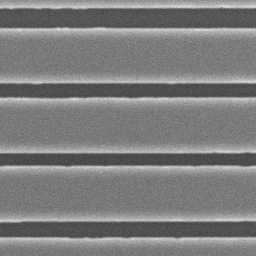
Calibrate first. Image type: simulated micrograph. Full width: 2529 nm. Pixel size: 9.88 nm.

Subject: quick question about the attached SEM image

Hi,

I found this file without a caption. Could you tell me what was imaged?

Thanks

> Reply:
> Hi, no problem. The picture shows lines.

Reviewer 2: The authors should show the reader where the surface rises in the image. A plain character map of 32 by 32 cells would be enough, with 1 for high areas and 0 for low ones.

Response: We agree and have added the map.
11111111111111111111111111111111
00000000000000000000000000000000
00000000000000000000000000000000
00000000000000000000000000000000
11111111111111111111111111111111
11111111111111111111111111111111
11111111111111111111111111111111
11111111111111111111111111111111
11111111111111111111111111111111
11111111111111111111111111111111
00000000000000000000000000000000
00000000000000000000000000000000
11111111111111111111111111111111
11111111111111111111111111111111
11111111111111111111111111111111
11111111111111111111111111111111
11111111111111111111111111111111
11111111111111111111111111111111
11111111111111111111111111111111
00000000000000000000000000000000
00000000000000000000000000000000
11111111111111111111111111111111
11111111111111111111111111111111
11111111111111111111111111111111
11111111111111111111111111111111
11111111111111111111111111111111
11111111111111111111111111111111
11111111111111111111111111111111
00000000000000000000000000000000
00000000000000000000000000000000
11111111111111111111111111111111
11111111111111111111111111111111